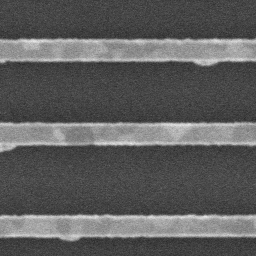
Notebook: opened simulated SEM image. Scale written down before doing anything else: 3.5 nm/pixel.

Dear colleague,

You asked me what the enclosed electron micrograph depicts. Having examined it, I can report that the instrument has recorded lines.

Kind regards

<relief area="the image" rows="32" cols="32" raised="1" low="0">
00000000000000000000000000000000
00000000000000000000000000000000
00000000000000000000000000000000
00000000000000000000000000000000
00000000000000000000000000000000
11111111111111111111111111111111
11111111111111111111111111111111
11111111111111111111101111111111
00000000000000000000000000000000
00000000000000000000000000000000
00000000000000000000000000000000
00000000000000000000000000000000
00000000000000000000000000000000
00000000000000000000000000000000
00000000000000000000000000000000
11111111111111111111111111111111
11111111111111111111111111111111
11111111111111111111111111111111
00000000000000000000000000000000
00000000000000000000000000000000
00000000000000000000000000000000
00000000000000000000000000000000
00000000000000000000000000000000
00000000000000000000000000000000
00000000000000000000000000000000
00000000000000000000000000000000
00000000000000000000000000000000
11111111111111111111111111111111
11111111111111111111111111111111
11111111111111111111111111111111
00000000000000000000000000000000
00000000000000000000000000000000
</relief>